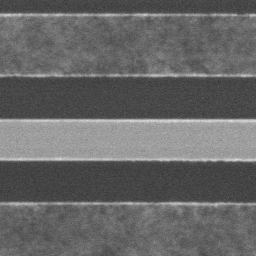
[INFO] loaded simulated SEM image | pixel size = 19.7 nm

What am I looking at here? lines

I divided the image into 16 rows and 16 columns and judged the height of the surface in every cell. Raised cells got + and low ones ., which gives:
................
++++++++++++++++
++++++++++++++++
++++++++++++++++
++++++++++++++++
................
................
................
++++++++++++++++
++++++++++++++++
................
................
................
++++++++++++++++
++++++++++++++++
++++++++++++++++